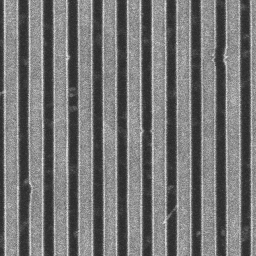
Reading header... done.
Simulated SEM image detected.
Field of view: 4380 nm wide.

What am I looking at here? parallel lines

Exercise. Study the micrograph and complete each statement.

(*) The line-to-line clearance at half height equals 203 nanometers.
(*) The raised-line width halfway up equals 216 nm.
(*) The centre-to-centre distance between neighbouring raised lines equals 422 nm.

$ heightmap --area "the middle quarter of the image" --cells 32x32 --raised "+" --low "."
.+++...+++...+++...+++....++....
.+++...+++...+++...+++....++....
.+++...+++...+++...+++....++....
.+++...+++...+++...+++....++....
.+++...+++...+++...+++....++....
.+++...+++...+++...+++....++....
.+++...+++...+++...+++....++....
.+++...+++...+++...+++....++....
.+++...+++...+++...+++....++...+
.+++...+++...+++...+++....++...+
.+++...+++...+++...+++....++....
.+++...+++...+++...+++....++....
.+++...+++...+++...+++....++....
.+++...+++...+++...+++....++....
.+++...+++...+++...+++....++....
.+++...+++...+++...+++...+++....
.+++...+++...+++...+++...+++....
.+++...+++...+++...+++...+++....
.+++...+++...+++...+++...+++....
.+++...+++...+++...+++...+++....
.+++...+++...+++...+++...+++....
.+++...+++...+++...+++...+++....
.+++...+++...+++...+++...+++....
.+++...+++...+++...+++...+++....
.+++...+++...+++...+++...+++....
.+++...+++...+++...+++...+++....
.+++...+++...+++...+++...+++....
.+++...+++...+++...+++...+++....
.+++...+++...+++...+++...+++....
.+++...+++...+++...+++...+++....
.+++...+++...+++...+++...+++....
.+++...+++...+++...+++...+++....